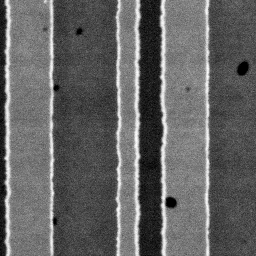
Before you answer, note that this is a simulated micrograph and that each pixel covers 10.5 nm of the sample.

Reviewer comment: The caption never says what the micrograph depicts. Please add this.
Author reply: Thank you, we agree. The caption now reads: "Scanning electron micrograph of lines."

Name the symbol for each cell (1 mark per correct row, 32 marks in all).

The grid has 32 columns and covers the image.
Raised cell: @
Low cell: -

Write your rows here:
-@@@@@@--------@@---@@@@@@------
-@@@@@@--------@@---@@@@@@------
-@@@@@@--------@@---@@@@@@------
-@@@@@@--------@@---@@@@@@------
-@@@@@@--------@@---@@@@@@------
-@@@@@@--------@@---@@@@@@------
-@@@@@@--------@@---@@@@@@------
-@@@@@@--------@@---@@@@@@------
-@@@@@@--------@@---@@@@@@------
-@@@@@---------@@---@@@@@@------
-@@@@@@--------@@---@@@@@@------
-@@@@@@--------@@---@@@@@@------
-@@@@@@--------@@---@@@@@@------
-@@@@@---------@@---@@@@@@------
-@@@@@@--------@@---@@@@@@------
-@@@@@---------@@---@@@@@@------
-@@@@@---------@@----@@@@@------
-@@@@@@--------@@---@@@@@@------
-@@@@@@--------@@---@@@@@@------
-@@@@@@--------@@---@@@@@@------
-@@@@@@--------@@---@@@@@@------
-@@@@@@--------@@---@@@@@@------
-@@@@@@--------@@---@@@@@@------
-@@@@@@--------@@---@@@@@@------
-@@@@@@--------@@---@@@@@@------
-@@@@@@--------@@---@@@@@@------
-@@@@@@--------@@---@@@@@@------
-@@@@@@--------@@----@@@@@------
-@@@@@@--------@@---@@@@@@------
-@@@@@@--------@@---@@@@@@------
-@@@@@@--------@@---@@@@@@------
-@@@@@@--------@@---@@@@@@------